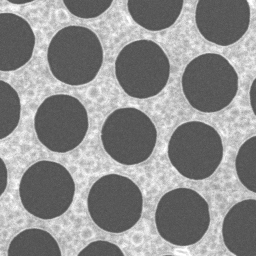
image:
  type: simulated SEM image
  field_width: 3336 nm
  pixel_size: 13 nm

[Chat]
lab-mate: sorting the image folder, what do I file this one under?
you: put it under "a regular array of holes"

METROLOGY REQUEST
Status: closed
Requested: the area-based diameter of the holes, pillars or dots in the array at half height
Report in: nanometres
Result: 746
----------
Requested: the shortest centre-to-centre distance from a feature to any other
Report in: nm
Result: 892